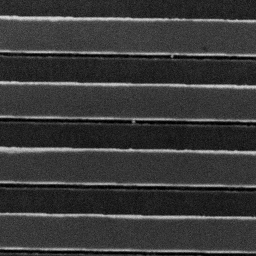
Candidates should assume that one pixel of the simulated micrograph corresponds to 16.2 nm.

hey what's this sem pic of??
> lines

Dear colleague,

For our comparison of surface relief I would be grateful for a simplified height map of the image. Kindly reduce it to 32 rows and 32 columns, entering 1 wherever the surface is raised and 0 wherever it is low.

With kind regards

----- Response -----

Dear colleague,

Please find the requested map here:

00000000000000000000000000000000
00000000000000000000000000000000
11111111111111111111111111110000
11111111111111111111111111111111
11111111111111111111111111111111
11111111111111111111111111111111
00011111111111111111111111111111
00000000000000000000000000000000
00000000000000000000000000000000
00000000000000000000000000000000
11111111111111000000000000000000
11111111111111111111111111111111
11111111111111111111111111111111
11111111111111111111111111111111
11111111111111111111111111111111
00000000000000000000000000000000
00000000000000000000000000000000
00000000000000000000000000000000
00000000000000000000000000000000
11111111111111111111111111111111
11111111111111111111111111111111
11111111111111111111111111111111
11111111111111111111111111111111
00000000000000000000000000000000
00000000000000000000000000000000
00000000000000000000000000000000
00000000000000000000000000000000
11111111111111111111111111111111
11111111111111111111111111111111
11111111111111111111111111111111
11111111111111111111111111111111
00000000000000000000000001111111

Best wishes